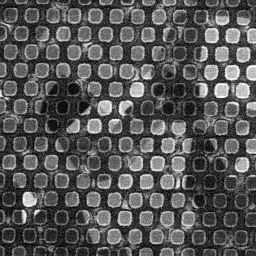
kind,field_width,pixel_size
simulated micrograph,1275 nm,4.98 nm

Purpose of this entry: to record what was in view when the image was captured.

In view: a regular array of raised bodies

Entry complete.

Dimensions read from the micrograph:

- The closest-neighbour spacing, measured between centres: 0.104 microns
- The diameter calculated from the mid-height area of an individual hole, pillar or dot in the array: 71.5 nm